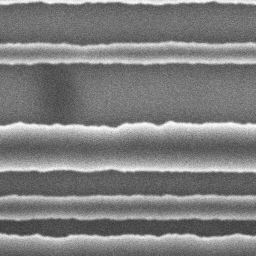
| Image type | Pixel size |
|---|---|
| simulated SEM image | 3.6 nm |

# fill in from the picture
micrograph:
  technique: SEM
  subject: lines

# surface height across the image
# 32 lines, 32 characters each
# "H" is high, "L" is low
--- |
LLLLLLLLLLLLLLLLLLLLLLLLLLLLLLLL
LLLLLLLLLLLLLLLLLLLLLLLLLLLLLLLL
LLLLLLLLLLLLLLLLLLLLLLLLLLLLLLLL
LLLLLLLLLLLLLLLLLLLLLLLLLLLLLLLL
LLLLLLLLLLLLLLLLLLLLLLLLLLLLLLLL
HHHHHHHHLLLLLLHHHHHHHHHHHHLLHHHH
HHHHHHHHHHHHHHHHHHHHHHHHHHHHHHHH
HHHHHHHHHHHHHHHHHHHHHHHHHHHHHHHH
LLLLLLLLLLLLLLLLLLLLLLLLLLLLLLLL
LLLLLLLLLLLLLLLLLLLLLLLLLLLLLLLL
LLLLLLLLLLLLLLLLLLLLLLLLLLLLLLLL
LLLLLLLLLLLLLLLLLLLLLLLLLLLLLLLL
LLLLLLLLLLLLLLLLLLLLLLLLLLLLLLLL
LLLLLLLLLLLLLLLLLLLLLLLLLLLLLLLL
LLLLLLLLLLLLLLLLLLLLLLLLLLLLLLLL
LLHLLLLLLLLLLLLLHHHLLHHHLHHHHHLL
HHHHHHHHHHHHHHHHHHHHHHHHHHHHHHHH
HHHHHHHHHHHHHHHHHHHHHHHHHHHHHHHH
HHHHHHHHHHHHHHHHHHHHHHHHHHHHHHHH
HHHHHHHHHHHHHHHHHHHHHHHHHHHHHHHH
HHHHHHHHHHHHHHHHHHHHHHHHHHHHHHHH
LLLLLLLLLLLLLLLLLLLLLLLLLLLLLLLL
LLLLLLLLLLLLLLLLLLLLLLLLLLLLLLLL
LLLLLLLLLLLLLLLLLLLLLLLLLLLLLLLL
LHLLLLLLLLLLHLLLLHLLHHLLHHHLLLLL
HHHHHHHHHHHHHHHHHHHHHHHHHHHHHHHH
HHHHHHHHHHHHHHHHHHHHHHHHHHHHHHHH
LLLLLLLLLLLLLLLLLLLLLLLLLLLLLLLL
LLLLLLLLLLLLLLLLLLLLLLLLLLLLLLLL
HHLLHLLLLHHHLLLHHHHLHHHHLLLLLHHL
HHHHHHHHHHHHHHHHHHHHHHHHHHHHHHHH
HHHHHHHHHHHHHHHHHHHHHHHHHHHHHHHH